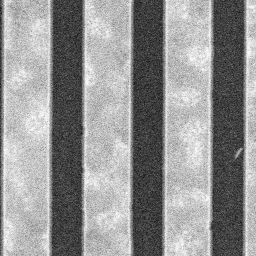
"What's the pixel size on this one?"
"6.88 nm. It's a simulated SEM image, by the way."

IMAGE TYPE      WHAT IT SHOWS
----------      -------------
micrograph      one or a few lines or trenches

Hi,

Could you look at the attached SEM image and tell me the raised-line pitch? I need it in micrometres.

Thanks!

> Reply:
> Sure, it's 0.554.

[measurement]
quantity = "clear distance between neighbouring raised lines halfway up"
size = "0.23 um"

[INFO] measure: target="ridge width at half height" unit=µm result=0.327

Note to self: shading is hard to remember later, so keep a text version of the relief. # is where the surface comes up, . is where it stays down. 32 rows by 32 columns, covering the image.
.#####.....#####.....#####.....#
.#####.....#####.....#####.....#
.#####.....#####.....#####.....#
.#####.....#####.....#####.....#
.#####.....#####.....#####.....#
.#####.....#####.....#####.....#
.#####.....#####.....#####.....#
######.....#####.....#####.....#
######.....#####.....#####.....#
######.....#####.....#####.....#
######.....#####.....#####.....#
######.....#####.....#####.....#
######.....#####.....#####.....#
######.....#####.....#####.....#
######.....#####.....#####.....#
######.....#####.....#####.....#
######.....#####.....#####.....#
######.....#####.....#####.....#
######.....#####.....#####.....#
######.....#####.....#####.....#
######.....#####.....#####.....#
######....######.....#####.....#
######....######.....#####.....#
######....######.....#####.....#
######....######.....#####.....#
######....######.....#####.....#
######....######.....#####.....#
######.....#####.....#####.....#
######....######.....#####.....#
######....######.....#####.....#
######....######.....#####.....#
######....######.....#####.....#